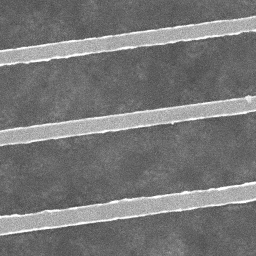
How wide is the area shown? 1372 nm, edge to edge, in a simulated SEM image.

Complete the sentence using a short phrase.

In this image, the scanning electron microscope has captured one or a few lines or trenches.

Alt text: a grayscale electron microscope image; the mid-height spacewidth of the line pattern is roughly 67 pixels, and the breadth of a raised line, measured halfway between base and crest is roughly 0.0793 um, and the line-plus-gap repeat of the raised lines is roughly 0.446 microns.